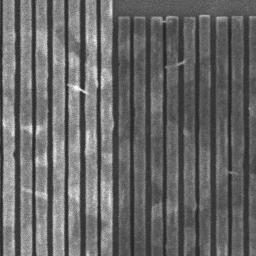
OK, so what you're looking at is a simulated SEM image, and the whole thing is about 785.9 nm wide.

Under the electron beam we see parallel lines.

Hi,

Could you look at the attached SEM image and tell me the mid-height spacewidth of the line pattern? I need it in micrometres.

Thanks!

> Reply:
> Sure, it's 0.0165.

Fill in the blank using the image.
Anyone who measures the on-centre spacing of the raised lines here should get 50.1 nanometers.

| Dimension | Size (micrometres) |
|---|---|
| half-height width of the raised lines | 0.0337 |